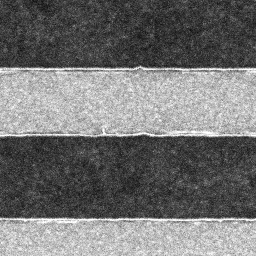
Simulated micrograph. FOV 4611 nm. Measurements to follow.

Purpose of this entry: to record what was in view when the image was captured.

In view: one or a few lines or trenches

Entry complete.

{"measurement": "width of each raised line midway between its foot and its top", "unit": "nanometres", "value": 1530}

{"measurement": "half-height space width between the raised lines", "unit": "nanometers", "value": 1170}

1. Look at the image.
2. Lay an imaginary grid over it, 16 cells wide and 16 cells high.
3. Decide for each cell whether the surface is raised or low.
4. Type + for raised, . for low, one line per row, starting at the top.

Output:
++++++++++++++++
++++++++++++++++
++++++++++++++++
++++++++++++++++
................
................
................
................
++++++++++++++++
++++++++++++++++
++++++++++++++++
++++++++++++++++
++++++++++++++++
++++++++++++++++
................
................